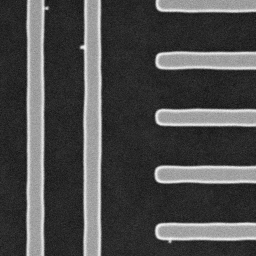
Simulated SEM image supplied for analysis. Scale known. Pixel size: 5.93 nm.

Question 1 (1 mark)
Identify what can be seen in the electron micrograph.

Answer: groups of lines, slits or small figures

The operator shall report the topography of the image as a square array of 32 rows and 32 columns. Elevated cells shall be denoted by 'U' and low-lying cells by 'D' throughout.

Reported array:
DDDUUDDDDDDUUDDDDDDDUUUUUUUUUUUU
DDDUUDDDDDDUUDDDDDDDDDDDDDDDDDDD
DDDUUDDDDDDUUDDDDDDDDDDDDDDDDDDD
DDDUUDDDDDDUUDDDDDDDDDDDDDDDDDDD
DDDUUDDDDDDUUDDDDDDDDDDDDDDDDDDD
DDDUUDDDDDDUUDDDDDDDDDDDDDDDDDDD
DDDUUDDDDDDUUDDDDDDDDDDDDDDDDDDD
DDDUUDDDDDDUUDDDDDDDUUUUUUUUUUUU
DDDUUDDDDDDUUDDDDDDDUUUUDUUUUUUU
DDDUUDDDDDDUUDDDDDDDDDDDDDDDDDDD
DDDUUDDDDDDUUDDDDDDDDDDDDDDDDDDD
DDDUUDDDDDDUUDDDDDDDDDDDDDDDDDDD
DDDUUDDDDDDUUDDDDDDDDDDDDDDDDDDD
DDDUUDDDDDDUUDDDDDDDDDDDDDDDDDDD
DDDUUDDDDDDUUDDDDDDUUUUUUUUUUUUU
DDDUUDDDDDDUUDDDDDDDUUUUUUUUUUUU
DDDUUDDDDDDUUDDDDDDDDDDDDDDDDDDD
DDDUUDDDDDDUUDDDDDDDDDDDDDDDDDDD
DDDUUDDDDDDUUDDDDDDDDDDDDDDDDDDD
DDDUUDDDDDDUUDDDDDDDDDDDDDDDDDDD
DDDUUDDDDDDUUDDDDDDDDDDDDDDDDDDD
DDDUUDDDDDDUUDDDDDDUUUUUUUUUUUUU
DDDUUDDDDDDUUDDDDDDDUUUUUUUUUUUU
DDDUUDDDDDDUUDDDDDDDDDDDDDDDDDDD
DDDUUDDDDDDUUDDDDDDDDDDDDDDDDDDD
DDDUUDDDDDDUUDDDDDDDDDDDDDDDDDDD
DDDUUDDDDDDUUDDDDDDDDDDDDDDDDDDD
DDDUUDDDDDDUUDDDDDDDDDDDDDDDDDDD
DDDUUDDDDDDUUDDDDDDDUUUUUUUUUUUU
DDDUUDDDDDDUUDDDDDDDUUUUUUUUUUUU
DDDUUDDDDDDUUDDDDDDDDDDDDDDDDDDD
DDDUUDDDDDDUUDDDDDDDDDDDDDDDDDDD